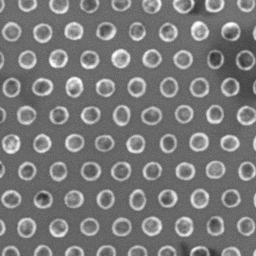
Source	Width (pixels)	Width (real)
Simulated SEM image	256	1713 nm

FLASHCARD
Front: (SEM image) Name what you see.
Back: a regular array of raised bodies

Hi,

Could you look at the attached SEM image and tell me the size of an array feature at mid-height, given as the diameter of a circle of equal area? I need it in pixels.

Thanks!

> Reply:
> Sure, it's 17.2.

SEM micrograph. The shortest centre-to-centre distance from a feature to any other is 0.206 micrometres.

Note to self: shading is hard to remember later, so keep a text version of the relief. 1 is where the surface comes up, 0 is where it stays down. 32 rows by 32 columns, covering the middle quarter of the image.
00000111000001100000001000000110
00000000000000000000000000000000
00000000000000000000000000000000
00000000000000000000000000000000
01110000011100000111000001110000
01110000111110001111000011110000
01110000111110001111000011110000
01110000011100000110000001110000
00000000000000000000000000000000
00000000000000000000000000000000
00000000000000000000000000000000
00000111000001110000111100001111
10000111100001110000111100001111
10000111100001110000111100001111
00000010000001110000111000000110
00000000000000000000000000000000
00000000000000000000000000000000
00000000000000000000000000000000
01110000111100000110000001110000
01111000111100001111000011110000
01111000111100001111000011110000
00100000011000000110000001100000
00000000000000000000000000000000
00000000000000000000000000000000
00000000000000000000000000000000
00000111000001110000011100000111
10000111100011110000111100001111
10000111100011110000111100001111
00000111000001110000011000000111
00000000000000000000000000000000
00000000000000000000000000000000
00000000000000000000000000000000